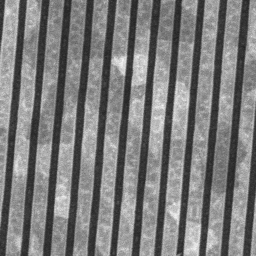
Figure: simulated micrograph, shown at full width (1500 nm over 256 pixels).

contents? parallel lines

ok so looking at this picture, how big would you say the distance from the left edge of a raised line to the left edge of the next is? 130 nanometers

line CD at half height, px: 13.6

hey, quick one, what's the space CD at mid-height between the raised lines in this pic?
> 51.1 nm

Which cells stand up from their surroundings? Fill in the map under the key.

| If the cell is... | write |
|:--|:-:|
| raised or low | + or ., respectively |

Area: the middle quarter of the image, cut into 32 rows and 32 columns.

.+++..++++..+++..++++..+++...+++
.+++..+++...+++..+++...+++..++++
.+++..+++...+++..+++...+++..++++
.+++..+++...+++..+++...+++..++++
.+++..+++...+++..+++...+++..+++.
.+++..+++...+++..+++...+++..+++.
+++...+++..++++..+++..++++..+++.
+++...+++..++++..+++..++++..+++.
+++...+++..+++...+++..+++...+++.
+++...+++..+++...+++..+++...+++.
+++..++++..+++..++++..+++...+++.
+++..++++..+++..++++..+++...+++.
+++..++++..+++..++++..+++...+++.
+++..+++...+++..+++...+++..++++.
+++..+++...+++..+++...+++..++++.
+++..+++...+++..++++..+++..++++.
+++..+++...+++..+++...+++..+++..
++...+++..++++..+++...+++..+++..
++...+++..++++..+++...+++..+++..
++...+++..+++...+++..++++..+++..
++...+++..+++...+++..+++...+++..
++...+++..+++...+++..+++...+++..
++..++++..+++...+++..+++..++++..
++..++++..+++...+++..+++..++++..
++..++++..+++...+++..+++...+++..
++..+++...+++..+++...+++..++++..
++..+++...+++..+++...+++..++++..
++..+++...+++..+++...+++..+++...
++..+++...+++..+++...+++..+++...
++..+++..+++...+++..++++..+++...
++..+++..+++...+++..++++..+++...
++..+++..++++..+++..++++..+++...